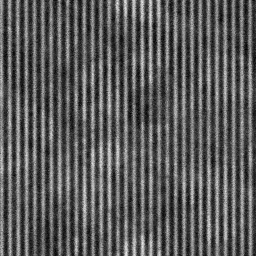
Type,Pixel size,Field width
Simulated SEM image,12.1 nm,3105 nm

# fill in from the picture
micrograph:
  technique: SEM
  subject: parallel lines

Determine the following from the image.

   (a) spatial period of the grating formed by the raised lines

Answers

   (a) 101 nm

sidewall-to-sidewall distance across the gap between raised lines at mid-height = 83.4 nm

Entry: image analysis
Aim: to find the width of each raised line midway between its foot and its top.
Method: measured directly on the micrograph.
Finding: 12.1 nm